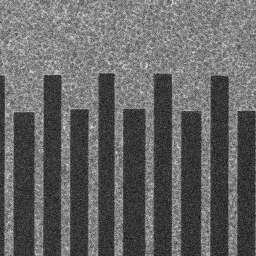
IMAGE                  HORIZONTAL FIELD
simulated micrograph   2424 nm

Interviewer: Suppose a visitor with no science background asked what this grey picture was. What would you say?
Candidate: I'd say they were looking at parallel lines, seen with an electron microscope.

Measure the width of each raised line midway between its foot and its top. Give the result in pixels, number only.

7.88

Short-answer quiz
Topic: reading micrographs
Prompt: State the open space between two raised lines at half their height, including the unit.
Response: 179 nm